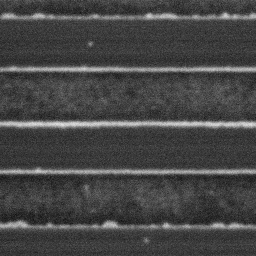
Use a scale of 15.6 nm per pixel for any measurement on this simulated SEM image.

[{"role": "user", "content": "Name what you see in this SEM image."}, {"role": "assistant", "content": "lines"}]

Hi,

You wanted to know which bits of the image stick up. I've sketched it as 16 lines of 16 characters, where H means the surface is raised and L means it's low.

LLLLLLLLLLLLLLLL
HHHHHHHHHHHHHHHH
HHHHHHHHHHHHHHHH
HHHHHHHHHHHHHHHH
LLLLLLLLLLLLLLLL
LLLLLLLLLLLLLLLL
LLLLLLLLLLLLLLLL
LLLLLLLLLLLLLLLL
HHHHHHHHHHHHHHHH
HHHHHHHHHHHHHHHH
HHHHHHHHHHHHHHHH
LLLLLLLLLLLLLLLL
LLLLLLLLLLLLLLLL
LLLLLLLLLLLLLLLL
HHHHHHHHHHHHHHHH
HHHHHHHHHHHHHHHH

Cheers